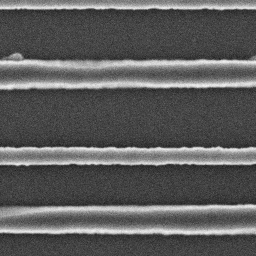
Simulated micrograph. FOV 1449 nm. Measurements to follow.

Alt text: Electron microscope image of lines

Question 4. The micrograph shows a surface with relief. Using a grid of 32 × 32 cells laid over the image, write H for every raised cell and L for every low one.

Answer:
HHHHHHHHHHHHHHHHHHHHHHHHHHHHHHHH
LLLLLLLLLLLLLLLLLLLLLLLLLLLLLLLL
LLLLLLLLLLLLLLLLLLLLLLLLLLLLLLLL
LLLLLLLLLLLLLLLLLLLLLLLLLLLLLLLL
LLLLLLLLLLLLLLLLLLLLLLLLLLLLLLLL
LLLLLLLLLLLLLLLLLLLLLLLLLLLLLLLL
LLLLLLLLLLLLLLLLLLLLLLLLLLLLLLLL
LLLLLLLLLLLLLLLLLLLLLLLLLLLLLLLL
HHHHHHHHHHHHHHHHHHHHHHHHHHHHHHHH
HHHHHHHHHHHHHHHHHHHHHHHHHHHHHHHH
HHHHHHHHHHHHHHHHHHHHHHHHHHHHHHHH
LLLLLLLLLLLLLLLLLLLLLLLLLLLLLLLL
LLLLLLLLLLLLLLLLLLLLLLLLLLLLLLLL
LLLLLLLLLLLLLLLLLLLLLLLLLLLLLLLL
LLLLLLLLLLLLLLLLLLLLLLLLLLLLLLLL
LLLLLLLLLLLLLLLLLLLLLLLLLLLLLLLL
LLLLLLLLLLLLLLLLLLLLLLLLLLLLLLLL
LLLLLLLLLLLLLLLLLLLLLLLLLLLLLLLL
HLHHHHHHHHHHLHHLHLLHLLHHHLHHLLLH
HHHHHHHHHHHHHHHHHHHHHHHHHHHHHHHH
HHHHHHHHHLHHHHLHHHHHHLHLHHHHHHHH
LLLLLLLLLLLLLLLLLLLLLLLLLLLLLLLL
LLLLLLLLLLLLLLLLLLLLLLLLLLLLLLLL
LLLLLLLLLLLLLLLLLLLLLLLLLLLLLLLL
LLLLLLLLLLLLLLLLLLLLLLLLLLLLLLLL
LLLLLLLLLLLLLLLLLLLLLLLLLLLLLLLL
HHHHHHHHHHHHHHHHHHHHHHHHHHHHHHHH
HHHHHHHHHHHHHHHHHHHHHHHHHHHHHHHH
HHHHHHHHHHHHHHHHHHHHHHHHHHHHHHHH
LLLLLLLLLLLLLLLLLLLLLLLLLLLLLLLL
LLLLLLLLLLLLLLLLLLLLLLLLLLLLLLLL
LLLLLLLLLLLLLLLLLLLLLLLLLLLLLLLL